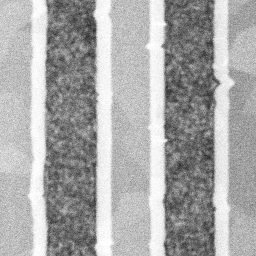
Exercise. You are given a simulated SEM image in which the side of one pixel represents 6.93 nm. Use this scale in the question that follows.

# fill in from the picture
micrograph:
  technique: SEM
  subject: one or a few lines or trenches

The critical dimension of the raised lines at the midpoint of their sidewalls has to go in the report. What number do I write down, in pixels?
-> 51.9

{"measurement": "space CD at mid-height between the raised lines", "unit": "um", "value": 0.458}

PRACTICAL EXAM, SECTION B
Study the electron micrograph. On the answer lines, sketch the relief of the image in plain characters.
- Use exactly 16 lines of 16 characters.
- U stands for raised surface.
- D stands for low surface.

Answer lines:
UUDDDDUUUUDDDDUU
UUDDDDUUUUDDDDUU
UUDDDDDUUUDDDDUU
UUDDDDDUUUDDDDUU
UUDDDDDUUUDDDDUU
UUDDDDDUUUDDDDUU
UUDDDDDUUUDDDDUU
UUDDDDDUUUDDDDUU
UUDDDDDUUUDDDDUU
UUDDDDDUUUDDDDUU
UUDDDDDUUUDDDDUU
UUDDDDDUUUDDDDUU
UUDDDDDUUUDDDDUU
UUDDDDDUUUDDDDUU
UUDDDDDUUUDDDDUU
UUDDDDDUUUDDDDUU